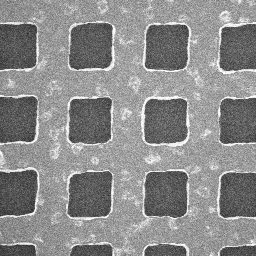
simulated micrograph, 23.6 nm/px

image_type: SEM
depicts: holes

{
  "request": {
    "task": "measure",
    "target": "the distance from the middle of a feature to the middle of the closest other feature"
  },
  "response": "1.74 um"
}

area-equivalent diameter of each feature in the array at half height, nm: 1180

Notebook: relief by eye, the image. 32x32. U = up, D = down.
UUUUUUUUUUUUUUUUUUUUUUUUUUUUUUUU
UUUUUUUUUUUUUUUUUUUUUUUUUUUUUUUU
UUUUUUUUUUUUUUUUUUUUUUUUUUUUUUUU
DDDDDUUUUDDDDDUUUUDDDDDUUUUUDDDD
DDDDDUUUUDDDDDUUUUDDDDDDUUUUDDDD
DDDDDUUUUDDDDDUUUUDDDDDDUUUDDDDD
DDDDDUUUUDDDDDUUUUDDDDDDUUUDDDDD
DDDDDUUUUDDDDDUUUUDDDDDDUUUDDDDD
DDDDUUUUUDDDDDUUUUDDDDDUUUUDDDDD
UUUUUUUUUUUUUUUUUUUUUUUUUUUUUUUU
UUUUUUUUUUUUUUUUUUUUUUUUUUUUUUUU
UUUUUUUUUUUUUUUUUUUUUUUUUUUUUUUU
DDDDDUUUUDDDDDUUUUDDDDDUUUUUDDDD
DDDDDUUUUDDDDDUUUUDDDDDUUUUDDDDD
DDDDDUUUDDDDDDUUUUDDDDDUUUUDDDDD
DDDDDUUUDDDDDDUUUUDDDDDUUUUDDDDD
DDDDDUUUDDDDDDUUUUDDDDDDUUUDDDDD
DDDDUUUUUDDDDDUUUUDDDDDUUUUUDDDD
UUUUUUUUUUUUUUUUUUUUUUUUUUUUUUUU
UUUUUUUUUUUUUUUUUUUUUUUUUUUUUUUU
UUUUUUUUUUUUUUUUUUUUUUUUUUUUUUUU
DDDDDUUUUUUDDDUUUUUDDDDUUUUUUUUU
DDDDDUUUUDDDDDUUUUDDDDDDUUUUDDDD
DDDDDUUUDDDDDDUUUUDDDDDDUUUDDDDD
DDDDDUUUUDDDDDUUUUDDDDDUUUUDDDDD
DDDDUUUUUDDDDDUUUUDDDDDUUUUDDDDD
DDDDUUUUDDDDDDUUUUDDDDDUUUUDDDDD
UUUUUUUUUUUUUUUUUUUUUUUUUUUUUUUU
UUUUUUUUUUUUUUUUUUUUUUUUUUUUUUUU
UUUUUUUUUUUUUUUUUUUUUUUUUUUUUUUU
UUDUUUUUUUUUDDUUUUUUDUUUUUUUUUUU
DDDDUUUUUDDDDDUUUUDDDDDUUUUUDDDD